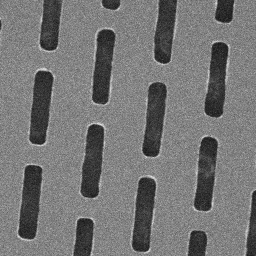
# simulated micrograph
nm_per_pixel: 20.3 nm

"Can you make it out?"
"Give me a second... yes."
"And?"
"a regular array of holes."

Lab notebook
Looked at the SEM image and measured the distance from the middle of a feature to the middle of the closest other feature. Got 1490 nm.